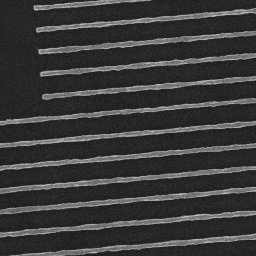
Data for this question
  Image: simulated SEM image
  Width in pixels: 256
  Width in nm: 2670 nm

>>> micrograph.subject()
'parallel lines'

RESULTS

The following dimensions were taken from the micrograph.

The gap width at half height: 0.19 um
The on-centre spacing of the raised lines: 234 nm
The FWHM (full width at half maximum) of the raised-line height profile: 0.0454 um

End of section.